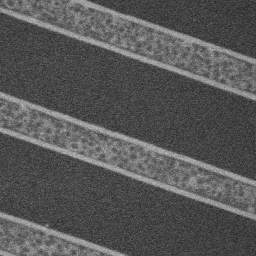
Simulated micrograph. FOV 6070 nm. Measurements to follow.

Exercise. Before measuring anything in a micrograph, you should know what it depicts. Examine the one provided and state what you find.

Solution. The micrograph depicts one or a few lines or trenches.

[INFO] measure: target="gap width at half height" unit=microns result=1.92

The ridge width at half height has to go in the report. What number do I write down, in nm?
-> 776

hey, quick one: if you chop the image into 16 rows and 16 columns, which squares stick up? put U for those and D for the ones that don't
UUUUUUDDDDDDDDDD
DDDUUUUUUDDDDDDD
DDDDDUUUUUUUDDDD
DDDDDDDDUUUUUUUD
DDDDDDDDDDDUUUUU
DDDDDDDDDDDDDDUU
UUDDDDDDDDDDDDDD
UUUUDDDDDDDDDDDD
DUUUUUUDDDDDDDDD
DDDDUUUUUUDDDDDD
DDDDDDDUUUUUUDDD
DDDDDDDDDDUUUUUU
DDDDDDDDDDDDDUUU
DDDDDDDDDDDDDDDD
UUUDDDDDDDDDDDDD
UUUUUUDDDDDDDDDD